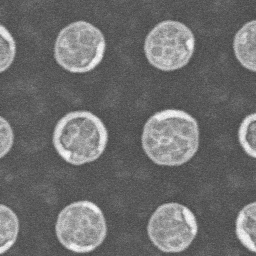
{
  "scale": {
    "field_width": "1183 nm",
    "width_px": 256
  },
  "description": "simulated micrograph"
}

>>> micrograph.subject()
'raised bodies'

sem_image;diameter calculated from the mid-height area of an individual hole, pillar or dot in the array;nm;228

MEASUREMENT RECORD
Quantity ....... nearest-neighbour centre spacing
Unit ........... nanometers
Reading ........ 414